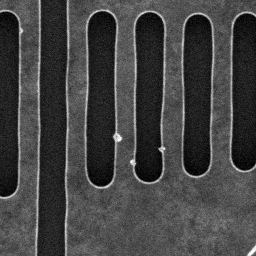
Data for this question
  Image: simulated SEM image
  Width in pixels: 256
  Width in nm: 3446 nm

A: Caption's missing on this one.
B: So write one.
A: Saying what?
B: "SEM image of groups of lines, slits or small figures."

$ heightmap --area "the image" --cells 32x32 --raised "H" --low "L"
HHHHHLLLHHHHHHHHHHHHHHHHHHHHHHHH
LHHHHLLLHHHHLLHHHHHHHHHHHHHHHHHH
LLHHHLLLHHHLLLHHHLLLHHHLLLHHHLLL
LLHHHLLLHHHLLLLHHLLLLHHLLLHHHLLL
LLHHHLLLLHHLLLLHHLLLLHHLLLLHHLLL
LLHHHLLLLHHLLLHHHLLLLHHLLLLHHLLL
LLHHHLLLLHHLLLHHHLLLLHHLLLLHHLLL
LLHHHLLLHHHLLLHHHLLLLHHLLLLHHLLL
LLHHHLLLHHHLLLHHHLLLLHHLLLLHHLLL
LLHHHLLLHHHLLLHHHLLLLHHLLLLHHLLL
LLHHHLLLHHHLLLHHHLLLLHHLLLLHHLLL
LLHHHLLLHHHLLLHHHLLLHHHLLLHHHLLL
LLHHHLLLHHHLLLHHHLLLHHHLLLHHHLLL
LLHHHLLLHHHLLLHHHLLLHHHLLLHHHLLL
LLHHHLLLHHHLLLLHHLLLHHHLLLHHHLLL
LLHHHLLLHHHLLLLHHLLLHHHLLLHHHLLL
LLHHHLLLHHHLLLHHHLLLHHHLLLHHHLLL
LLHHHLLLHHHLLLHHHLLLHHHLLLHHHLLL
LLHHHLLLHHHLLLHHHLLLHHHLLLHHHLLL
LLHHHLLLHHHLLLHHHLLLHHHLLLHHHLLL
LLHHHLLLHHHLLLHHHLLLHHHLLLHHHLLL
LLHHHLLLHHHLLLHHHLLLHHHLLLHHHHHH
LLHHHLLLHHHLLLHHHHLLHHHHHHHHHHHH
LLHHHLLLHHHHHHHHHHHHHHHHHHHHHHHH
LHHHHLLLHHHHHHHHHHHHHHHHHHHHHHHH
HHHHHLLLHHHHHHHHHHHHHHHHHHHHHHHH
HHHHHLLLHHHHHHHHHHHHHHHHHHHHHHHH
HHHHHLLLHHHHHHHHHHHHHHHHHHHHHHHH
HHHHHLLLHHHHHHHHHHHHHHHHHHHHHHHH
HHHHHLLLHHHHHHHHHHHHHHHHHHHHHHHH
HHHHHLLLHHHHHHHHHHHHHHHHHHHHHHHH
HHHHHLLLHHHHHHHHHHHHHHHHHHHHHHHH